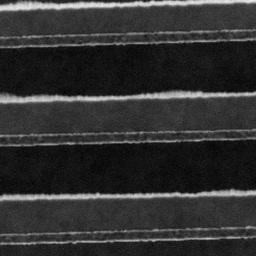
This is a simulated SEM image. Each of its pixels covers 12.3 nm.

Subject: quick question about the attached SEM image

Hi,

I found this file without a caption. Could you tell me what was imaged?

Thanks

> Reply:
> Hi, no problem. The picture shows lines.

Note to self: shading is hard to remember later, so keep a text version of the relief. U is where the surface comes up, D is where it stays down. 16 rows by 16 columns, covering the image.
DUUUUUUUUUUUUUUU
UUUUUUUUUUUUUUUU
UUUUUUUUUUUUUUUD
DDDDDDDDDDDDDDDD
DDDDDDDDDDDDDDDD
DDDDDDDDDDDDDDDD
UUUUUUUUUUUUUUUU
UUUUUUUUUUUUUUUU
UUUUUUUUUUUUUUUU
DDDDDDDDDDDDDDDD
DDDDDDDDDDDDDDDD
DDDDDDDDDDDDDDDD
UUUUUUUUUUUUUUUU
UUUUUUUUUUUUUUUU
UUUUUUUUUUUUUUUU
DDDDDDDDDDDDDDDD